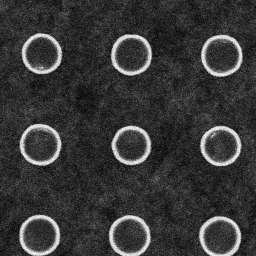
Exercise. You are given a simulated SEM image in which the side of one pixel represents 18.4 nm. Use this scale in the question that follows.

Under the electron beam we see raised bodies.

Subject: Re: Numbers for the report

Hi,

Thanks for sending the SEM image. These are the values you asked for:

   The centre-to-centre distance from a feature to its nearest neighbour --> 1640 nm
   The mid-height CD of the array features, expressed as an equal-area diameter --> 695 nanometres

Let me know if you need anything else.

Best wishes